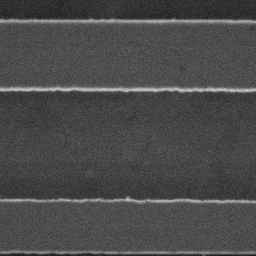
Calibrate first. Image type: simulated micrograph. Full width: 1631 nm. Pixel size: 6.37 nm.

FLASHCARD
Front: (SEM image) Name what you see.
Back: lines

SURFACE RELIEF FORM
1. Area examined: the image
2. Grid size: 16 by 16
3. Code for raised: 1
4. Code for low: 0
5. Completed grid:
0000000000000000
1111111111111111
1111111111111111
1111111111111111
1111111111111111
1111111111111111
0000000000000000
0000000000000000
0000000000000000
0000000000000000
0000000000000000
0000000000000000
1111111101110000
1111111111111111
1111111111111111
1111111111111111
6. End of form